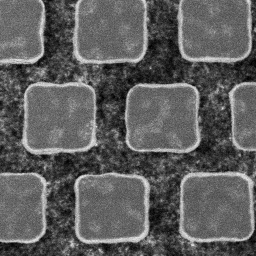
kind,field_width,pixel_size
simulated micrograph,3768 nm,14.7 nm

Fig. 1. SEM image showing raised bodies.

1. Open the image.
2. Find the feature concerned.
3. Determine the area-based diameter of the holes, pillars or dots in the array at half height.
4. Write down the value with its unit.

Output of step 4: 1130 nm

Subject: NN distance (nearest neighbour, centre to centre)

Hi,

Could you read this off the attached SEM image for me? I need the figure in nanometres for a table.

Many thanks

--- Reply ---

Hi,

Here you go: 1520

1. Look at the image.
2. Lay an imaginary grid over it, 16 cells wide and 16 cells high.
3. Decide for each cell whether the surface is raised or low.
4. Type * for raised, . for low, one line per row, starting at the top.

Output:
***..****..*****
***..****..*****
***..****..*****
**...****...***.
................
..****..****...*
..****..****..**
..****..****...*
..****..****...*
................
................
***..****..*****
***..****..*****
***..****..*****
***..****..*****
................